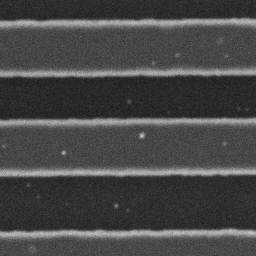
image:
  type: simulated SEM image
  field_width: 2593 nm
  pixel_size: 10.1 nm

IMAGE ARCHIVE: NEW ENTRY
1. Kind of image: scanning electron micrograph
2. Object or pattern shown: lines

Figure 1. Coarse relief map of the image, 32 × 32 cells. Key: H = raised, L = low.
LLLLLLLLLLLLLLLLLLLLLLLLLLLLLLLL
LLLLLLLLLLLLLLLLLLLLLLLLLLLLLLLL
LLLLLLLLLLLLLLLLLLLLLLLLHHLHHHHH
HHHHHHHHHHHHHHHHHHHHHHHHHHHHHHHH
HHHHHHHHHHHHHHHHHHHHHHHHHHHHHHHH
HHHHHHHHHHHHHHHHHHHHHHHHHHHHHHHH
HHHHHHHHHHHHHHHHHHHHHHHHHHHHHHHH
HHHHHHHHHHHHHHHHHHHHHHHHHHHHHHHH
HHHHHHHHHHHHHHHHHHHHHHHHHHHHHHHH
LLLLLLLLLLLLLLLLLLLLLLLLLLLLLLLL
LLLLLLLLLLLLLLLLLLLLLLLLLLLLLLLL
LLLLLLLLLLLLLLLLLLLLLLLLLLLLLLLL
LLLLLLLLLLLLLLLLLLLLLLLLLLLLLLLL
LLLLLLLLLLLLLLLLLLLLLLLLLLLLLLLL
LLLLLLLLLLLLLLLLLLLLLLLLLLLLLLLL
HHHHHHHHHHHHHHHHHHHHHHHHHHHHHHHH
HHHHHHHHHHHHHHHHHHHHHHHHHHHHHHHH
HHHHHHHHHHHHHHHHHHHHHHHHHHHHHHHH
HHHHHHHHHHHHHHHHHHHHHHHHHHHHHHHH
HHHHHHHHHHHHHHHHHHHHHHHHHHHHHHHH
HHHHHHHHHHHHHHHHHHHHHHHHHHHHHHHH
HHHHHHHHHHHHHHHHHHHHHHHHHHHHHHHH
LLLLLLLLLLLLLLLLLLLLLLLLLLLLLLLL
LLLLLLLLLLLLLLLLLLLLLLLLLLLLLLLL
LLLLLLLLLLLLLLLLLLLLLLLLLLLLLLLL
LLLLLLLLLLLLLLLLLLLLLLLLLLLLLLLL
LLLLLLLLLLLLLLLLLLLLLLLLLLLLLLLL
LLLLLLLLLLLLLLLLLLLLLLLLLLLLLLLL
LLLLLLLLLLLLLLLLLLLLLLLLLLLLLLLL
HHHHHHHHHHHHHHHHHHHHHHHHHHHHHHHH
HHHHHHHHHHHHHHHHHHHHHHHHHHHHHHHH
HHHHHHHHHHHHHHHHHHHHHHHHHHHHHHHH